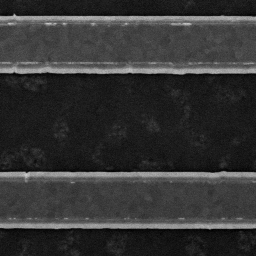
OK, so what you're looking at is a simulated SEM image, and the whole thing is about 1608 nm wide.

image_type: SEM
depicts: one or a few lines or trenches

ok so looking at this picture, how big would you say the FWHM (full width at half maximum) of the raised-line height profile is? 0.33 micrometres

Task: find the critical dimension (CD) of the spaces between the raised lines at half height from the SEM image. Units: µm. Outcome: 0.647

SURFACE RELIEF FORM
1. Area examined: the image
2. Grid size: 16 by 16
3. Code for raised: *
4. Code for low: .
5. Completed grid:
................
****************
****************
****************
................
................
................
................
................
................
................
****************
****************
****************
................
................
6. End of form